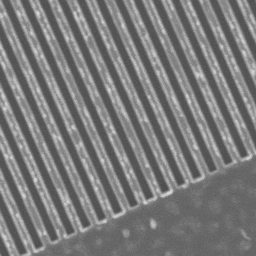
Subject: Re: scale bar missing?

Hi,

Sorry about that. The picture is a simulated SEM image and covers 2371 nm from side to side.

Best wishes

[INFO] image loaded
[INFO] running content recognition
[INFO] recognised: parallel lines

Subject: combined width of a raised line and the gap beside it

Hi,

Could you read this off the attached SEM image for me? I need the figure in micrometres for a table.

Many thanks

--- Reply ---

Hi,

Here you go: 0.16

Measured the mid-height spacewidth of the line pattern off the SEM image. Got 0.0826 micrometres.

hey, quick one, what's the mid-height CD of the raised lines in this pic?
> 75.2 nanometers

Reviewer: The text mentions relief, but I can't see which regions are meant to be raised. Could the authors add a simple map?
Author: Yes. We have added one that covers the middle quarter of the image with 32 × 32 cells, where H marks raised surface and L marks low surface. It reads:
HLLHHHLLHHLLLHHLLLHHLLHHLLLHHLLL
HLLLHHLLLHHLLHHLLLHHLLLHHLLLHHLL
HHLLHHLLLHHLLLHHLLLHHLLHHLLLHHLL
HHLLLHHLLHHHLLHHLLLHHLLLHHLLHHHL
LHLLLHHLLLHHLLLHHLLHHLLLHHLLLHHL
LHHLLLHHLLHHLLLHHLLLHHLLLHHLLHHL
LHHLLLHHLLLHHLLLHHLLHHLLLHHLLLHH
LLHHLLLHHLLHHLLLHHLLLHHLLHHLLLHH
LLHHLLLHHLLLHHLLLHLLLHHLLLHHLLLH
LLLHHLLHHHLLHHLLLHHLLLHHLLHHLLLH
HLLHHLLLHHLLLHHLLHHHLLHHLLLHHLLH
HLLHHHLLHHLLLHHLLLHHLLHHHLLHHLLL
HLLLHHLLLHHLLHHHLLHHLLLHHLLLHHLL
HHLLHHHLLHHLLLHHLLLHHLLHHLLLHHLL
HHLLLHHLLLHHLLHHLLLHHLLLHHLLHHHL
LHHLLHHLLLHHLLLHHLLHHHLLHHLLLHHL
LHHLLLHHLLLHHLLHHLLLHHLLLHHLLHHH
LHHHLLHHLLLHHLLLHHLLHHLLLHHLLLHH
LLHHLLLHHLLHHHLLHHLLLHHLLLHHLLHH
LLHHLLLHHLLLHHLLLHHLLHHLLLHHLLLH
LLLHHLLHHHLLHHLLLHHLLLHHLLHHHLLH
HLLHHLLLHHLLLHHLLLHHLLHHLLLHHLLL
HLLLHHLLHHLLLHHLLLHHLLLHHLLHHLLL
HHLLHHLLLHHLLLHHLLHHLLLHHLLLHHLL
HHLLLHHLLHHLLLHHLLLHHLLHHHLLHHLL
HHHLLHHLLLHHLLLHHLLHHLLLHHLLLHHL
LHHLLHHHLLHHLLLHHLLLHHLLHHHLLHHL
LHHLLLHHLLLHHLLHHHLLHHLLLHHLLLHH
LLHHLLHHLLLHHLLLHHLLHHHLLHHLLLHH
LLHHLLLHHLLHHHLLHHLLLHHLLLHHLLHH
LLLHHLLHHLLLHHLLLHHLLHHLLLHHHHHH
LLLHHLLLHHLLLHHLLHHLLLHHLLHHHHHH